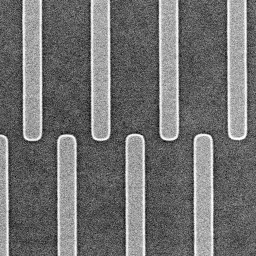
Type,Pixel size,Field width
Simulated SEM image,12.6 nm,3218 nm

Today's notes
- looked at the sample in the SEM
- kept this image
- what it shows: groups of lines, slits or small figures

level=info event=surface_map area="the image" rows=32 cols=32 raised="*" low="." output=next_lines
...**......***......**.......**.
...**......***......**.......**.
...**......***......**.......**.
...**......***......**.......**.
...**......***......**.......**.
...**......***......**.......**.
...**......***......**.......**.
...**......***......**.......**.
...**......***......**.......**.
...**......***......**.......**.
...**......***......**.......**.
...**......***......**.......**.
...**......***......**.......**.
...**......***......**.......**.
...**......***......**.......**.
...**......***......**.......**.
...**.......**......**.......**.
*...*..**...*...**......**......
*......**.......**......***.....
*......**.......**......***.....
*......**.......**......***.....
*......**.......**......***.....
*......**.......**......***.....
*......**.......**......***.....
*......**.......**......***.....
*......**.......**......***.....
*......**.......**......***.....
*......**.......**......***.....
*......**.......**......***.....
*......**.......**......***.....
*......**.......**......***.....
*......**.......**......***.....